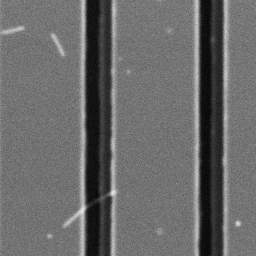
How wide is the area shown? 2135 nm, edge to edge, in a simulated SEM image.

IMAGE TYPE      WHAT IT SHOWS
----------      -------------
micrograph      lines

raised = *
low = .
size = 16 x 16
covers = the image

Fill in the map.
*****..*****..**
*****..*****..**
*****..*****..**
*****..*****..**
*****..*****..**
*****..*****..**
*****..*****..**
*****..*****..**
*****..*****..**
*****..*****..**
*****..*****..**
*****..*****..**
*****..*****..**
*****..*****..**
*****..*****..**
*****..*****..**